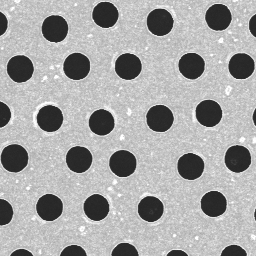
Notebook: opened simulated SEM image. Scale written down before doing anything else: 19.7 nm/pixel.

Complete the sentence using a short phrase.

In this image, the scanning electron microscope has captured a regular array of holes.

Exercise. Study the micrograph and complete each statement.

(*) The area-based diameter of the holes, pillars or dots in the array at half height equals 534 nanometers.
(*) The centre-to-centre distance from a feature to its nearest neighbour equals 0.976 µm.